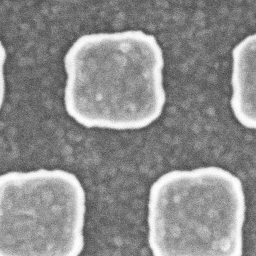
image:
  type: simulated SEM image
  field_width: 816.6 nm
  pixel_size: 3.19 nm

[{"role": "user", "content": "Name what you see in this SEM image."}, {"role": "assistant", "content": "raised bodies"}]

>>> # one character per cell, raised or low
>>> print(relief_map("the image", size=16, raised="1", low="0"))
0000000000000000
0000000000000000
0000011110000001
0000111111000001
0000111111000001
0000111111000001
0000111111000001
0000011110000001
0000000000000000
0000000000000000
0000000000000000
1111100000111110
1111100001111110
1111100001111110
1111100001111110
1111100000111110